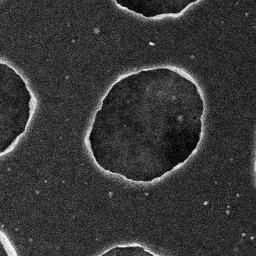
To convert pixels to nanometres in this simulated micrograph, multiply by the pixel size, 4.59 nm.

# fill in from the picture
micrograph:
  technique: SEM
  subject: holes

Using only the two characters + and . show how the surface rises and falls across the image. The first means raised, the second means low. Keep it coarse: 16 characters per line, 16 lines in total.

++++++++....++++
++++++++++++++++
++++++++++++++++
++++++++++++++++
.++++++++..+++++
..+++++.....++++
..++++.......+++
..++++.......+++
.+++++.......+++
++++++......++++
++++++.....+++++
++++++++++++++++
++++++++++++++++
++++++++++++++++
++++++++++++++++
+++++++..+++++++